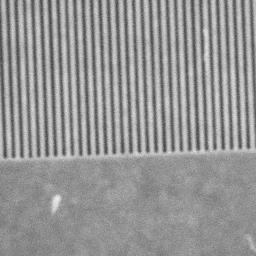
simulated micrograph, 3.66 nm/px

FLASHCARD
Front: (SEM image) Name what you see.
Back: parallel lines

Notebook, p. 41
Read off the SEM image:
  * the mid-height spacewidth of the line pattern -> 0.0156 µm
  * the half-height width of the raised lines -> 15.6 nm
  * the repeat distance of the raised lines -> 0.0308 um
